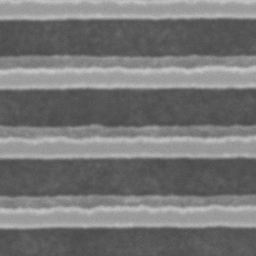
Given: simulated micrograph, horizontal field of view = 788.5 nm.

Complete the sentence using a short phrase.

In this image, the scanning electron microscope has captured lines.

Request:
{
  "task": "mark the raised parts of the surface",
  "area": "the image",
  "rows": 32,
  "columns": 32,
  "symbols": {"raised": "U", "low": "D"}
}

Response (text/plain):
UUUUUUUUUUUUUUUUUUUUUUUUUUUUUUUU
UUUUUUUUUUUUUUUUUUUUUUUUUUUUUUUU
DDDDDDDDDDDDDDDDDDDDDDDDDDDDDDDD
DDDDDDDDDDDDDDDDDDDDDDDDDDDDDDDD
DDDDDDDDDDDDDDDDDDDDDDDDDDDDDDDD
DDDDDDDDDDDDDDDDDDDDDDDDDDDDDDDD
DDDDDDDDDDDDDDDDDDDDDDDDDDDDDDDD
UUUUUUUUUUUUUUUUUUUUUUUUUUUUUUUU
UUUUUUUUUUUUUUUUUUUUUUUUUUUUUUUU
UUUUUUUUUUUUUUUUUUUUUUUUUUUUUUUU
UUUUUUUUUUUUUUUUUUUUUUUUUUUUUUUU
DDDDDDDDDDDDDDDDDDDDDDDDDDDDDDDD
DDDDDDDDDDDDDDDDDDDDDDDDDDDDDDDD
DDDDDDDDDDDDDDDDDDDDDDDDDDDDDDDD
DDDDDDDDDDDDDDDDDDDDDDDDDDDDDDDD
DDDDDDDDDDDDDDDDDDDDDDDDDDDDDDDD
UUUUUUUUUUUUUUUUUUUUUUUUUUUUUUUU
UUUUUUUUUUUUUUUUUUUUUUUUUUUUUUUU
UUUUUUUUUUUUUUUUUUUUUUUUUUUUUUUU
UUUUUUUUUUUUUUUUUUUUUUUUUUUUUUUU
DDDDDDDDDDDDDDDDDDDDDDDDDDDDDDDD
DDDDDDDDDDDDDDDDDDDDDDDDDDDDDDDD
DDDDDDDDDDDDDDDDDDDDDDDDDDDDDDDD
DDDDDDDDDDDDDDDDDDDDDDDDDDDDDDDD
DDDDDDDDDDDUUUUDUDDDDDDDDDDUUUUU
UUUUUUUUUUUUUUUUUUUUUUUUUUUUUUUU
UUUUUUUUUUUUUUUUUUUUUUUUUUUUUUUU
UUUUUUUUUUUUUUUUUUUUUUUUUUUUUUUU
DDUDDDDDDDDDDDDDDDDDDDDDDDDDDDDD
DDDDDDDDDDDDDDDDDDDDDDDDDDDDDDDD
DDDDDDDDDDDDDDDDDDDDDDDDDDDDDDDD
DDDDDDDDDDDDDDDDDDDDDDDDDDDDDDDD